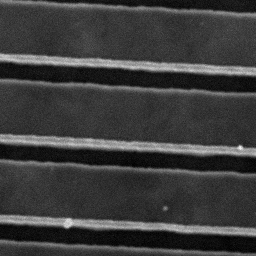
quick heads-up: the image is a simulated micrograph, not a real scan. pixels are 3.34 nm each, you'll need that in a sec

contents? lines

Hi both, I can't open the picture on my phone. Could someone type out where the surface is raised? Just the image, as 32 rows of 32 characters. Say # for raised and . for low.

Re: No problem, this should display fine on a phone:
###########.....................
#############################...
################################
################################
################################
################################
################################
################################
..................##############
................................
############....................
###########################.....
################################
################################
################################
################################
################################
################################
...............#################
................................
##########......................
#########################.......
################################
################################
################################
################################
################################
################################
...............#################
................................
#######.........................
#############################...